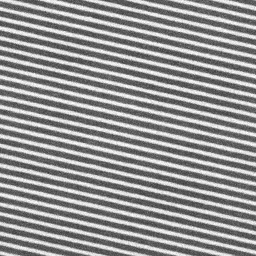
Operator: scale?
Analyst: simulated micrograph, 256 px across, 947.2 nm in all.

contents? parallel lines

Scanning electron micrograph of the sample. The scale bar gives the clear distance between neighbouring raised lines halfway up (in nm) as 22.1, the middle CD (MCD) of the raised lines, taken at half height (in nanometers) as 12.7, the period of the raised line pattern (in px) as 9.51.